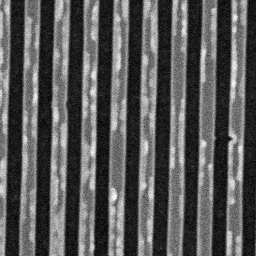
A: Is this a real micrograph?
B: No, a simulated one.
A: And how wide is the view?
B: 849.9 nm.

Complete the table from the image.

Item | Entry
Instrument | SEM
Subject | parallel lines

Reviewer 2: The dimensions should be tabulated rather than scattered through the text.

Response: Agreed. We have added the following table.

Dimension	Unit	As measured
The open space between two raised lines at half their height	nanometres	51.5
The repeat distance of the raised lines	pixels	29.5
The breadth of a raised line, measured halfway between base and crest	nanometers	45.3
